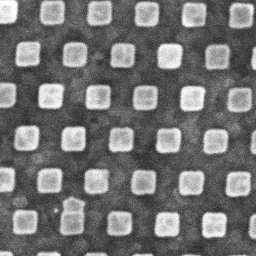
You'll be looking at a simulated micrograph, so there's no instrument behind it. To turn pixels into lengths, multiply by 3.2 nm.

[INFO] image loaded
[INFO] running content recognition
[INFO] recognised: a regular array of raised bodies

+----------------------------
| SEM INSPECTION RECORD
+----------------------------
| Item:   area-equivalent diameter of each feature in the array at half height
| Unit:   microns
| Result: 0.0773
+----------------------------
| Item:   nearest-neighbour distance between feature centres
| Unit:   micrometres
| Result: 0.15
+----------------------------